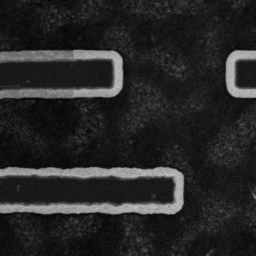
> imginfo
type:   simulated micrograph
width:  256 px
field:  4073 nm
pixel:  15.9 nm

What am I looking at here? one or a few lines or trenches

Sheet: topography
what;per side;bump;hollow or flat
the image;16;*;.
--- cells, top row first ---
................
................
................
*******........*
*******.......**
*******........*
................
................
................
................
................
***********.....
***********.....
................
................
................